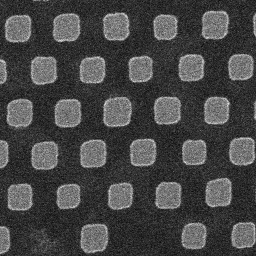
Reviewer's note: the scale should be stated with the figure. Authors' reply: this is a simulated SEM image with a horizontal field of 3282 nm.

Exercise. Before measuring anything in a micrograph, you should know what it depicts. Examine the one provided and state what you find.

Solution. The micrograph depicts a regular array of raised bodies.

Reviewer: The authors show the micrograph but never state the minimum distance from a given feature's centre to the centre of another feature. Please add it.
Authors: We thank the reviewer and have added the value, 0.617 microns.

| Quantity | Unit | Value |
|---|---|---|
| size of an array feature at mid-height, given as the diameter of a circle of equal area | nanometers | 353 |